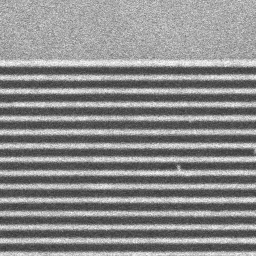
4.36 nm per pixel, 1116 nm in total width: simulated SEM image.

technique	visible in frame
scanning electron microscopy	parallel lines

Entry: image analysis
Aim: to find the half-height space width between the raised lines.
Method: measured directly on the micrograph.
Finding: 32.7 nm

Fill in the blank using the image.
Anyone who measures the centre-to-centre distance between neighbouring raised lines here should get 59.3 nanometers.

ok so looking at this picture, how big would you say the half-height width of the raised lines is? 24.5 nm